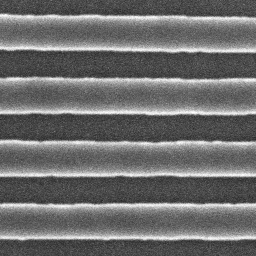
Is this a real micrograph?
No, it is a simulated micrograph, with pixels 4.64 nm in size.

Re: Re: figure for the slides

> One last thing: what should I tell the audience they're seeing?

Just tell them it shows lines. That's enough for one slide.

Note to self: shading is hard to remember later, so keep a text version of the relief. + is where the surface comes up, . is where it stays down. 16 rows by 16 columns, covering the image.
................
++++++++++++++++
++++++++++++++++
................
................
++++++++++++++++
++++++++++++++++
................
................
++++++++++++++++
++++++++++++++++
................
................
++++++++++++++++
++++++++++++++++
................